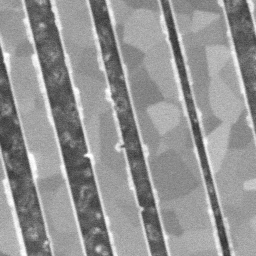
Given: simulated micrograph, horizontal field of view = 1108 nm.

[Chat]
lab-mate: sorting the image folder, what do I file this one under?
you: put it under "one or a few lines or trenches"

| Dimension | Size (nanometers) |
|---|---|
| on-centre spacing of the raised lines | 265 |